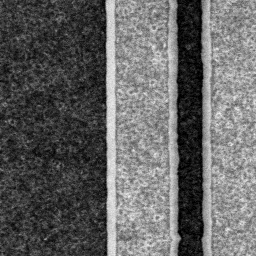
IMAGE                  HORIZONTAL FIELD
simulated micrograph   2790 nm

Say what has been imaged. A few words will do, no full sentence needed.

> one or a few lines or trenches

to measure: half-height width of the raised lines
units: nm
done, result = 686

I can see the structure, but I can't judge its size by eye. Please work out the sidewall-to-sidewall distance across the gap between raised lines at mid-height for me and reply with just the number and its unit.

0.353 µm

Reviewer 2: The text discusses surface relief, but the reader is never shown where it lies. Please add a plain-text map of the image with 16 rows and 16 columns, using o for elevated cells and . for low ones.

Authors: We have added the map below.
.......oooo..ooo
.......oooo..ooo
.......oooo..ooo
.......oooo..ooo
.......oooo..ooo
.......oooo..ooo
.......oooo..ooo
.......oooo..ooo
.......oooo..ooo
.......oooo..ooo
.......oooo..ooo
.......oooo..ooo
.......oooo..ooo
.......oooo..ooo
.......oooo..ooo
.......oooo..ooo